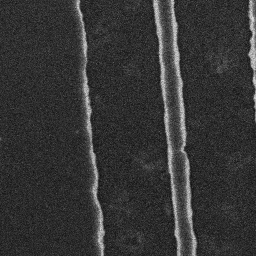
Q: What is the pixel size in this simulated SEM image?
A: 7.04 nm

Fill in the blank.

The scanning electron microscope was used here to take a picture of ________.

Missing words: one or a few lines or trenches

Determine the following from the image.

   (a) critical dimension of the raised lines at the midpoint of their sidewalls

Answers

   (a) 0.114 microns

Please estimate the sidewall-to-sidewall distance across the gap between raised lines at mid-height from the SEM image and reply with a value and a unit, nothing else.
529 nanometers